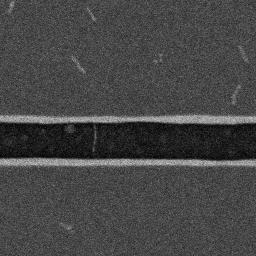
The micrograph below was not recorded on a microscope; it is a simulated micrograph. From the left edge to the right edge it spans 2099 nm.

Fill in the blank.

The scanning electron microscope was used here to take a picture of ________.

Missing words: one or a few lines or trenches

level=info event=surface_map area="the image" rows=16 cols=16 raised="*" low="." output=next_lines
****************
****************
****************
****************
****************
****************
****************
................
................
................
****************
****************
****************
****************
****************
****************